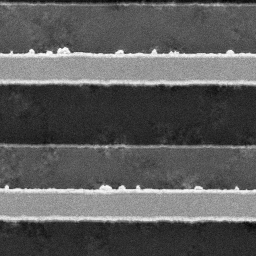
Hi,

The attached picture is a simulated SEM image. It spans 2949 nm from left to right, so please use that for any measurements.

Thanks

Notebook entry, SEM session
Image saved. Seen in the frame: lines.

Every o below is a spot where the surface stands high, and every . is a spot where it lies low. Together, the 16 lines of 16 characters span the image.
oooooooooooooooo
oooooooooooooooo
oooooooooooooooo
oooooooooooooooo
oooooooooooooooo
................
................
................
................
oooooooooooooooo
oooooooooooooooo
oooooooooooooooo
oooooooooooooooo
oooooooooooooooo
................
................